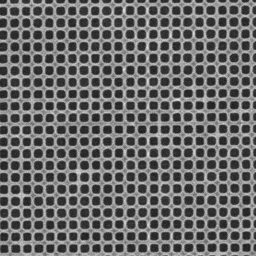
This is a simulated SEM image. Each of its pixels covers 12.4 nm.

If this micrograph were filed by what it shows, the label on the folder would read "a regular array of holes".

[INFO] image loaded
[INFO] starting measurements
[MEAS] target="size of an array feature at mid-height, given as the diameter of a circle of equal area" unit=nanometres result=121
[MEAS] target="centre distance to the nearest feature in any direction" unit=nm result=142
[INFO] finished